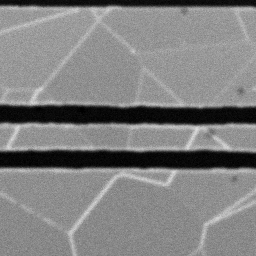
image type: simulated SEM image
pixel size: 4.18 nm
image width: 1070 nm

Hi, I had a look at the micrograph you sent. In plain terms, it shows lines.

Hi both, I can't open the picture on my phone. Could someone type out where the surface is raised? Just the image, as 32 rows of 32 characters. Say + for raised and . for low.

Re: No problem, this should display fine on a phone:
................................
++++++++++++++++++++++++++++++++
++++++++++++++++++++++++++++++++
++++++++++++++++++++++++++++++++
++++++++++++++++++++++++++++++++
++++++++++++++++++++++++++++++++
++++++++++++++++++++++++++++++++
++++++++++++++++++++++++++++++++
++++++++++++++++++++++++++++++++
++++++++++++++++++++++++++++++++
++++++++++++++++++++++++++++++++
++++++++++++++++++++++++++++++++
++++++++++++++++++++++++++++++++
................................
................................
++.++.+.......+.................
++++++++++++++++++++++++++++++++
++++++++++++++++++++++++++++++++
++++++++++++++++++++++++++++++++
................................
................................
++++++++++++++++++++++++++++++++
++++++++++++++++++++++++++++++++
++++++++++++++++++++++++++++++++
++++++++++++++++++++++++++++++++
++++++++++++++++++++++++++++++++
++++++++++++++++++++++++++++++++
++++++++++++++++++++++++++++++++
++++++++++++++++++++++++++++++++
++++++++++++++++++++++++++++++++
++++++++++++++++++++++++++++++++
++++++++++++++++++++++++++++++++